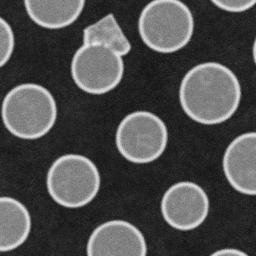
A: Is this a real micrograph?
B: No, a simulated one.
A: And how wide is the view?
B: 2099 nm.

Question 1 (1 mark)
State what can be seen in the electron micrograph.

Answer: raised bodies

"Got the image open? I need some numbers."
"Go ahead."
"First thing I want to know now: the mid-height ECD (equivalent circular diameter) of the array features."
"0.419 microns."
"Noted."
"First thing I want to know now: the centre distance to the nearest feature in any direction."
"0.666 microns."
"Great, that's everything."